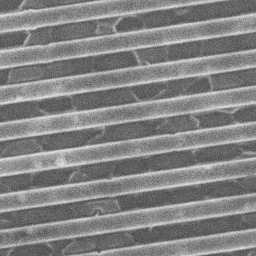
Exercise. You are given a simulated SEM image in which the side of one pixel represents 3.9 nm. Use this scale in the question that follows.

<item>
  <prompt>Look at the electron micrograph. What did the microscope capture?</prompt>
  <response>parallel lines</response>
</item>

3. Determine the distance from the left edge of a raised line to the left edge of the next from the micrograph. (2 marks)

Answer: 138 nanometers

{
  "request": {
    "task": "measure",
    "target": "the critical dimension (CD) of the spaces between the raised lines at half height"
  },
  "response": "72.4 nanometers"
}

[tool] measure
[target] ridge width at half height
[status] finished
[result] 0.069 micrometres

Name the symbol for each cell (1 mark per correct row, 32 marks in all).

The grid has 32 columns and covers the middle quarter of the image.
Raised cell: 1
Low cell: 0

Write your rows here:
00000000000000000000111111111111
00000000000001111111111111111111
00000011111111111111111111111111
11111111111111111111111111111000
11111111111111111111110000000000
11111111111111100000000000000000
11111111100000000000000000000000
11000000000000000000000000000000
00000000000000000000000000001111
00000000000000000000011111111111
00000000000000111111111111111111
00000001111111111111111111111111
01111111111111111111111111111100
11111111111111111111110000000000
11111111111111100000000000000000
11111111000000000000000000000000
10000000000000000000000000000000
00000000000000000000000000001111
00000000000000000000011111111111
00000000000000111111111111111111
00000001111111111111111111111111
11111111111111111111111111110000
11111111111111111111100000000000
11111111111111100000000000000000
11111111000000000000000000000000
10000000000000000000000000000000
00000000000000000000000000011111
00000000000000000000111111111111
00000000000001111111111111111111
00000001111111111111111111111111
11111111111111111111111111111000
11111111111111111111111000000000